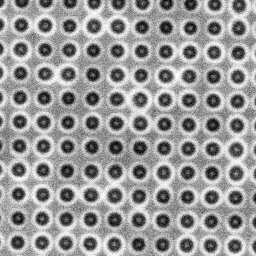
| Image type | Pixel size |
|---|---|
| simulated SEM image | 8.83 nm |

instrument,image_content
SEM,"an array of small figures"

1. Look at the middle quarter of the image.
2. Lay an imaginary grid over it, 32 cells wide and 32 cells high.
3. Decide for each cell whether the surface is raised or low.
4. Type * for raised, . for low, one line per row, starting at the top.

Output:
*.******************************
...***...***...***...***...***..
...**....**.....*....**.....*...
...**....**....**....**.....*...
..*****.****...***..****...***..
********************************
********************************
...***...***...**....***...***..
...**....**....**....**....**...
...**....**....**....**....**...
******..****..***....***...***..
********************************
******************.*************
...**....***...**....***..****..
...**....**....**....**....**...
...**....**....**....**....**...
..****..****..****...**...****..
********************************
********************************
..***...****..****..****..****..
...**....**....**....**....**...
...**....**....**....**....**...
.*****..****..****..****...***..
********************************
********************************
..****..****..****..****..****..
...**....**....**....**....**...
...**....**....**....**....**...
.*****..***...***...***....**...
*************************.******
******.*************************
...**....**...***...****..****..